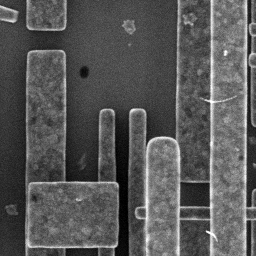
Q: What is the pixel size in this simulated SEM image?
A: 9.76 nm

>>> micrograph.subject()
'wiring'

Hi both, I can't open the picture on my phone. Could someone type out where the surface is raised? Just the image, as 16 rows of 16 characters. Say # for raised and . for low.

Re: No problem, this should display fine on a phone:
.............##.
.............##.
.............##.
.............##.
.............##.
.............##.
.............##.
.............##.
.............##.
.........##..##.
.........##..##.
.........##..##.
.........##..##.
.........##..##.
.........##..##.
.........##..##.